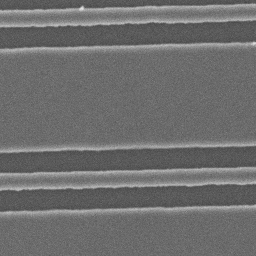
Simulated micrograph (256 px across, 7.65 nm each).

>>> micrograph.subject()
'lines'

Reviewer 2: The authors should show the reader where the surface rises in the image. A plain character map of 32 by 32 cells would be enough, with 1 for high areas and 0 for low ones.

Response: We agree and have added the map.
00000000000000000000000000000001
11111111111111111111111111111111
11111111111111111111111111111111
00000000000000000000000000000000
00000000000000000000000000000000
00000000000000000000000011111111
11111111111111111111111111111111
11111111111111111111111111111111
11111111111111111111111111111111
11111111111111111111111111111111
11111111111111111111111111111111
11111111111111111111111111111111
11111111111111111111111111111111
11111111111111111111111111111111
11111111111111111111111111111111
11111111111111111111111111111111
11111111111111111111111111111111
11111111111111111111111111111111
11111111111111111111100000000000
00000000000000000000000000000000
00000000000000000000000000000000
00000001111111111111111111111111
11111111111111111111111111111111
11111111111100000000000000000000
00000000000000000000000000000000
00000000000000000000000000000000
11111111111111111111111111111111
11111111111111111111111111111111
11111111111111111111111111111111
11111111111111111111111111111111
11111111111111111111111111111111
11111111111111111111111111111111